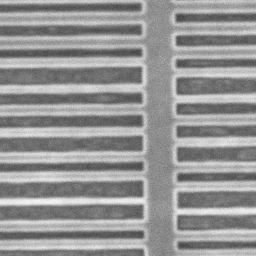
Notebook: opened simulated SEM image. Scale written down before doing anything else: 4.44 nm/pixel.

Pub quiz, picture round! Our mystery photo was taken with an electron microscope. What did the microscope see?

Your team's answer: groups of lines, slits or small figures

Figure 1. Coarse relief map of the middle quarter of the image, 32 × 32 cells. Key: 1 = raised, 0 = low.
00000000000000000000111111110000
00000000000000000000111111111111
00000000000000000000111111111111
00000000000000000000111111110000
00000000000000000000111111110000
00000000011111111111111111110000
11111111111111111111111111110000
00000000000000000000111111110000
00000000000000000000111111111111
00000000000000000000111111111111
11111111111111111111111111110000
11111111111111111111111111110000
11111111111111100000111111110000
00000000000000000000111111111111
00000000000000000000111111111111
00000000000000000000111111110000
11111111111111111111111111110000
11111111111111111101111111110000
00000000000000000000111111110000
00000000000000000000111111111111
00000000000000000000111111110000
00000000000000000000111111110000
11111111111111111111111111110000
11111111111111111111111111110000
00000000000000000000111111110000
00000000000000000000111111111111
00000000000000000000111111111111
11111111111111111111111111110000
11111111111111111111111111110000
00000000000000000000111111110000
00000000000000000000111111111111
00000000000000000000111111111111